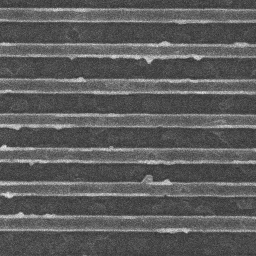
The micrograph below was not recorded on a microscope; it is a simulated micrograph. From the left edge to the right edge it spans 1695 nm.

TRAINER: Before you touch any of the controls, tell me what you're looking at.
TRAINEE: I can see parallel lines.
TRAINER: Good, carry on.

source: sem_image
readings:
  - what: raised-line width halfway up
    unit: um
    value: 0.091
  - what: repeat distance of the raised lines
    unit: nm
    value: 229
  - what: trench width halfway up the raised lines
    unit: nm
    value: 137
